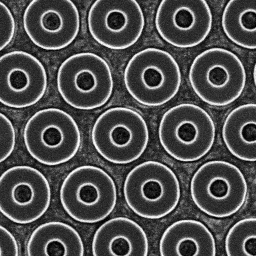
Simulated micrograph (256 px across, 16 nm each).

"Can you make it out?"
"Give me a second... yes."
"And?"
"a regular array of ring-shaped raised bodies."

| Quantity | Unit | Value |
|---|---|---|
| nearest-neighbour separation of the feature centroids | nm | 1020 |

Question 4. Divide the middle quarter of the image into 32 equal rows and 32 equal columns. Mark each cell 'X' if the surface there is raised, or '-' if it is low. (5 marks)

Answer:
XXXXXXXXXXX-----XXXXXXXXXXXX----
XXXXXXXXXXX----XXXXX---XXXXXX---
XXXX---XXXXX---XXXXX----XXXXX---
XXX-----XXXX---XXXXX-----XXXX---
XXX-----XXXX---XXXXX----XXXXX---
XXX-----XXXX----XXXXX---XXXXX---
XXXX---XXXXX----XXXXXXXXXXXX----
XXXXXXXXXXX------XXXXXXXXXXX----
XXXXXXXXXXX-------XXXXXXXXX-----
-XXXXXXXXX----------XXXXX-------
--XXXXXX---------------------XXX
-----------XXXXX-----------XXXXX
----------XXXXXXXX--------XXXXXX
XX-------XXXXXXXXXX------XXXXXXX
XXX-----XXXXXXXXXXXX----XXXXXX-X
XXX-----XXXXXXXXXXXX----XXXXX---
XXX----XXXXX----XXXXX---XXXX----
XXXX---XXXXX-----XXXX---XXXX----
XXXX---XXXXX-----XXXX---XXXXX---
XXXX---XXXXXX---XXXXX---XXXXXX-X
XXX-----XXXXXXXXXXXX-----XXXXXXX
XXX-----XXXXXXXXXXXX------XXXXXX
XX-------XXXXXXXXXX--------XXXXX
X----------XXXXXXX----------XXXX
-------------XXX----------------
-------------------XXXXXX-------
---XXXXXX--------XXXXXXXXXX-----
--XXXXXXXX------XXXXXXXXXXX-----
-XXXXXXXXXX-----XXXXXXXXXXXX----
XXXXXXXXXXXX---XXXXX---XXXXX----
XXXXX---XXXXX--XXXXX----XXXX----
XXXX----XXXXX--XXXXX-----XXXX---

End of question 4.